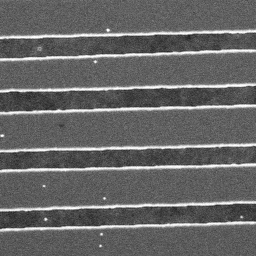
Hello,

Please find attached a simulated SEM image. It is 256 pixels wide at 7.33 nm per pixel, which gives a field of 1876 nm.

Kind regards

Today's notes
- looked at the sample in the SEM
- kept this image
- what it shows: lines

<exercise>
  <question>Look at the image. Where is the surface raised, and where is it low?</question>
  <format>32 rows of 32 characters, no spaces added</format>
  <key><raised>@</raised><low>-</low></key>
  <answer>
@@@@@@@@@@@@@@@@@@@@@@@@@@@@@@@@
@@@@@@@@@@@@@@@@@@@@@@@@@@@@@@@@
@@@@@@@@@@@@@@@@@@@@@@@@@@@@@@@@
@@@@@@@@@@@@@@@@@@@@@@@@@@@@@@@@
@@@@@@@@@-----------------------
--------------------------------
--------------------------@@@@@@
@@@@@@@@@@@@@@@@@@@@@@@@@@@@@@@@
@@@@@@@@@@@@@@@@@@@@@@@@@@@@@@@@
@@@@@@@@@@@@@@@@@@@@@@@@@@@@@@@@
@@@@@@@@@@@@@@@@@@@@@@@@@@@@@@@@
--------------------------------
--------------------------------
----------------------@@@@@@@@@@
@@@@@@@@@@@@@@@@@@@@@@@@@@@@@@@@
@@@@@@@@@@@@@@@@@@@@@@@@@@@@@@@@
@@@@@@@@@@@@@@@@@@@@@@@@@@@@@@@@
@@@@@@@@@@@@@@@@@@@@@@@@@@@@@@@@
@@@@@@@@@@@@@@@@----------------
--------------------------------
--------------------------------
@@@@@@@@@@@@@@@@@@@@@@@@@@@@@@@@
@@@@@@@@@@@@@@@@@@@@@@@@@@@@@@@@
@@@@@@@@@@@@@@@@@@@@@@@@@@@@@@@@
@@@@@@@@@@@@@@@@@@@@@@@@@@@@@@@@
@@@@@@@@@@@@@@@@@@@@@@@@@-------
--------------------------------
--------------------------------
----------@@@@@@@@@@@@@@@@@@@@@@
@@@@@@@@@@@@@@@@@@@@@@@@@@@@@@@@
@@@@@@@@@@@@@@@@@@@@@@@@@@@@@@@@
@@@@@@@@@@@@@@@@@@@@@@@@@@@@@@@@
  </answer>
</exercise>